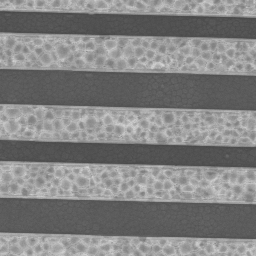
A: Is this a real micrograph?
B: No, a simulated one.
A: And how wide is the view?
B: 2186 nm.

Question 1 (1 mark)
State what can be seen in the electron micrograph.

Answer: one or a few lines or trenches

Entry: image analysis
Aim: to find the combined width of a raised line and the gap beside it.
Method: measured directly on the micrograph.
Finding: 549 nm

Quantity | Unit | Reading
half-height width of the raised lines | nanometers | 296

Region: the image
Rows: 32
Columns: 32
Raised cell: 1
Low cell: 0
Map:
11111111111111111111111111111111
00000000000111111111111111111111
00000000000000000000000000000000
00000000000000000000000000000000
11111111111000000000000000000000
11111111111111111111111111111111
11111111111111111111111111111111
11111111111111111111111111111111
01111111111111111111111111111111
00000000000000000000000000000000
00000000000000000000000000000000
00000000000000000000000000000000
00000000000000000000000000000000
11111111111110000000000000000000
11111111111111111111111111111111
11111111111111111111111111111111
11111111111111111111111111111111
00001111111111111111111111111111
00000000000000000000000000000000
00000000000000000000000000000000
11111111000000000000000000000000
11111111111111111111111111111111
11111111111111111111111111111111
11111111111111111111111111111111
11111111111111111111111111111111
00000000000000000000000000000000
00000000000000000000000000000000
00000000000000000000000000000000
00000000000000000000000000000000
11111111111000000000000000000000
11111111111111111111111111111111
11111111111111111111111111111111